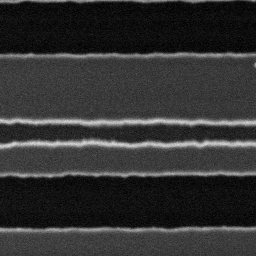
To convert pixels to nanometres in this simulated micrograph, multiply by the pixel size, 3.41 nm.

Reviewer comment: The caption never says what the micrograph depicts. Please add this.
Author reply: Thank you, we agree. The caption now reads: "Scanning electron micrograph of lines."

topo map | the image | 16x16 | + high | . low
................
................
................
++++++++++++++++
++++++++++++++++
++++++++++++++++
++++++++++++++++
++++++++++++++++
++++++++++++++++
++++++++++++++++
++++++++++++++++
................
................
................
++++++++++++++++
++++++++++++++++